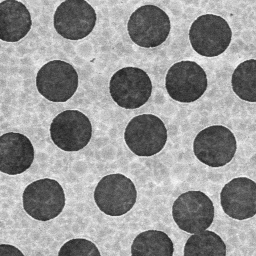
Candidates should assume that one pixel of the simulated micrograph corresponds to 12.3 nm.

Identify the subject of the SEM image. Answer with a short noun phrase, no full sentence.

a regular array of holes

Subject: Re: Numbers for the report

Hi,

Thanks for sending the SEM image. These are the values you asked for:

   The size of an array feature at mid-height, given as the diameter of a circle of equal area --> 534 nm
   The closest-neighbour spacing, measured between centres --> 644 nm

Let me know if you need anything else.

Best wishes